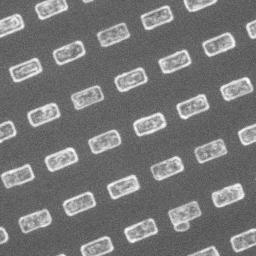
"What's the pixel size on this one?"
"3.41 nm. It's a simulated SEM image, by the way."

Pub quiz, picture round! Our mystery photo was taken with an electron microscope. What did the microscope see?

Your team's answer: a regular array of raised bodies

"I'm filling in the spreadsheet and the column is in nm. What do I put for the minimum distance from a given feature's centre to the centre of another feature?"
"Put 160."